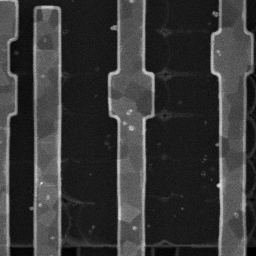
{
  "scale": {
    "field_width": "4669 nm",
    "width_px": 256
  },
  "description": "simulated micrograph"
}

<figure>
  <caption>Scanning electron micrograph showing wiring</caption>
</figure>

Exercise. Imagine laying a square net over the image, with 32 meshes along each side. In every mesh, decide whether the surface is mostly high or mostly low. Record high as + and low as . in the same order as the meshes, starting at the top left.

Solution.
++.............+++..........+++.
++..+++........+++..........+++.
++..+++........+++..........+++.
++..+++........+++.........++++.
++..+++........+++.........++++.
+...+++........+++.........+++++
+...+++........+++.........+++++
+...+++........+++.........+++++
+...+++........+++.........+++++
++..+++.......+++++........++++.
++..+++.......+++++........++++.
++..+++.......+++++.........+++.
++..+++.......+++++.........+++.
++..+++.......+++++.........+++.
+...+++.......+++++.........+++.
+...+++........+++..........+++.
+...+++........+++..........+++.
+...+++........+++..........+++.
+...+++........+++..........+++.
+...+++........+++..........+++.
+...+++........+++..........+++.
+...+++........+++..........+++.
+...+++........+++..........+++.
+...+++........+++..........+++.
+...+++........+++..........+++.
+...+++........+++..........+++.
+...+++........+++..........+++.
+...+++........+++..........+++.
+...+++........+++..........+++.
+...+++........+++..........+++.
+...+++........+++.........++++.
+...+++........+++..........+++.